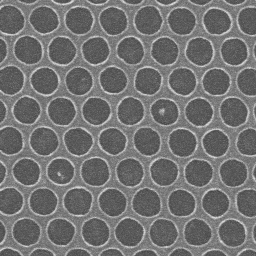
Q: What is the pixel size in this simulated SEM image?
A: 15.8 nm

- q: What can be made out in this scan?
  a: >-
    a regular array of holes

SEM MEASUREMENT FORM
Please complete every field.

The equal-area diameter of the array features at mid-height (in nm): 441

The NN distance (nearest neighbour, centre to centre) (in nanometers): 537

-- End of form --